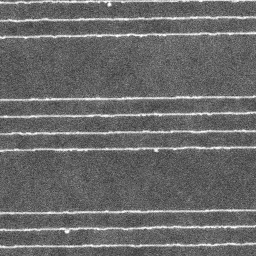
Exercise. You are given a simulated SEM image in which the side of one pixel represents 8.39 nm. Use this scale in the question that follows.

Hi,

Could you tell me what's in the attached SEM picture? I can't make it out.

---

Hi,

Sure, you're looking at lines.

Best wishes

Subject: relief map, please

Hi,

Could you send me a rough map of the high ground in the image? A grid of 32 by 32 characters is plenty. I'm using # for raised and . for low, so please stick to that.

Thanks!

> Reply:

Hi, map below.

................................
................................
.#.#############################
################################
#############.#..#..............
................................
................................
................................
................................
................................
................................
................................
################################
################################
#####....#......................
................................
.................###############
################################
#######################.#####...
................................
................................
................................
................................
................................
................................
................................
.............###################
################################
###################.............
................................
............................####
################################